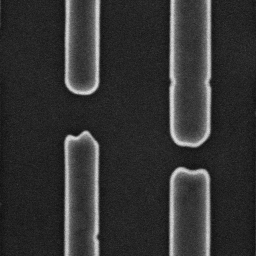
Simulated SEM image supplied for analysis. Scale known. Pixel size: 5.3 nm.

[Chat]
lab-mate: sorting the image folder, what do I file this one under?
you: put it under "one or a few lines or trenches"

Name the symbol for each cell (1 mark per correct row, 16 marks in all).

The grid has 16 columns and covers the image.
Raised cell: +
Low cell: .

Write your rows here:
....++.....++...
....++.....++...
....++.....++...
....++.....++...
....++.....++...
....++.....++...
...........++...
...........++...
.....+.....++...
....++..........
....++..........
....++.....++...
....++.....++...
....++.....++...
....++.....++...
....++.....++...